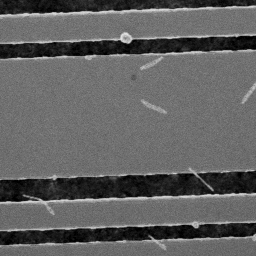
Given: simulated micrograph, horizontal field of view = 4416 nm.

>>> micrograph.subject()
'lines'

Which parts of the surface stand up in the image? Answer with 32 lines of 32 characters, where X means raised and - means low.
--------------------------------
-------------XXXXXXXXXXXXXXXXXXX
XXXXXXXXXXXXXXXXXXXXXXXXXXXXXXXX
XXXXXXXXXXXXXXXXXXXXXXXXXXXXXXXX
XXXXXXXXXXXXXXXXXXXXXXXXXX---X--
--------------------------------
---------------------------XXXXX
XXXXXXXXXXXXXXXXXXXXXXXXXXXXXXXX
XXXXXXXXXXXXXXXXXXXXXXXXXXXXXXXX
XXXXXXXXXXXXXXXXXXXXXXXXXXXXXXXX
XXXXXXXXXXXXXXXXXXXXXXXXXXXXXXXX
XXXXXXXXXXXXXXXXXXXXXXXXXXXXXXXX
XXXXXXXXXXXXXXXXXXXXXXXXXXXXXXXX
XXXXXXXXXXXXXXXXXXXXXXXXXXXXXXXX
XXXXXXXXXXXXXXXXXXXXXXXXXXXXXXXX
XXXXXXXXXXXXXXXXXXXXXXXXXXXXXXXX
XXXXXXXXXXXXXXXXXXXXXXXXXXXXXXXX
XXXXXXXXXXXXXXXXXXXXXXXXXXXXXXXX
XXXXXXXXXXXXXXXXXXXXXXXXXXXXXXXX
XXXXXXXXXXXXXXXXXXXXXXXXXXXXXXXX
XXXXXXXXXXXXXXXXXXXXXXXXXXXXXXXX
XXXXXXXXXXXXXXXXXXXXXXXXXX------
--------------------------------
--------------------------------
--------------------------XXXXXX
XXXXXXXXXXXXXXXXXXXXXXXXXXXXXXXX
XXXXXXXXXXXXXXXXXXXXXXXXXXXXXXXX
XXXXXXXXXXXXXXXXXXXXXXXXXXXXXXXX
XXXXXXXXXX----------------------
--------------------------------
---------XXXXXXXXXXXXXXXXXXXXXXX
XXXXXXXXXXXXXXXXXXXXXXXXXXXXXXXX